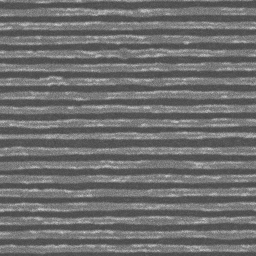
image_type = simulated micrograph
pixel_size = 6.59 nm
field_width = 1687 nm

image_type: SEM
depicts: parallel lines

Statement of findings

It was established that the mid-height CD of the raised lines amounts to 50.2 nanometers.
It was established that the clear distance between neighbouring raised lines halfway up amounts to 44.5 nm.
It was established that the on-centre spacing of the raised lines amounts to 0.0917 um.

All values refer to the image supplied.